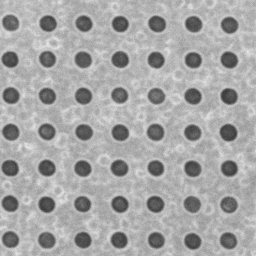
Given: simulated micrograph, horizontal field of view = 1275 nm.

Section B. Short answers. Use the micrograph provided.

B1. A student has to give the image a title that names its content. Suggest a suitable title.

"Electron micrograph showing a regular array of holes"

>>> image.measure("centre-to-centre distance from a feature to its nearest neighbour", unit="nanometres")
178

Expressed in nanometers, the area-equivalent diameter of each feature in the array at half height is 87.6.